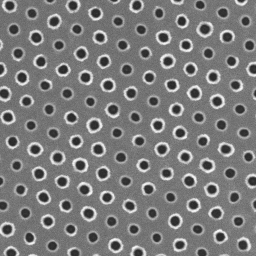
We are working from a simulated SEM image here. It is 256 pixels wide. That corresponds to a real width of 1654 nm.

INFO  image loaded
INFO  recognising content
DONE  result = a regular array of holes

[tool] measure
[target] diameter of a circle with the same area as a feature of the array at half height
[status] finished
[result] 0.061 micrometres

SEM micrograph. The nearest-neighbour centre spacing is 154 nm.